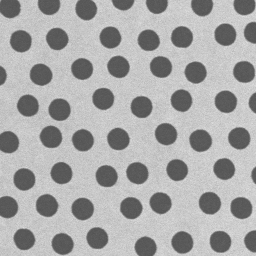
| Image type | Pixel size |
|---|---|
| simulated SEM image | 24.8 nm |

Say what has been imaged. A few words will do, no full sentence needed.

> a regular array of holes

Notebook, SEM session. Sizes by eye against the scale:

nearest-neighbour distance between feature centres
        846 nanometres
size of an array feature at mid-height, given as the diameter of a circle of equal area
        0.562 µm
